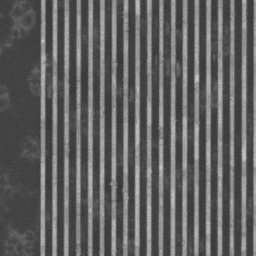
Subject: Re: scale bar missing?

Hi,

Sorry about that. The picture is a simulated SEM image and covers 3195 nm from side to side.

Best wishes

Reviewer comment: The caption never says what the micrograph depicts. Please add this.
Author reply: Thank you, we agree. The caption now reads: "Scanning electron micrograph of parallel lines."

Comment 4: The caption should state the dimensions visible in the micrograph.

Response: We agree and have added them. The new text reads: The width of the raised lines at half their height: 32.8 nanometres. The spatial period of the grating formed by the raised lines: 148 nm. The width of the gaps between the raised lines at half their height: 123 nm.